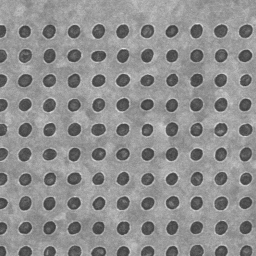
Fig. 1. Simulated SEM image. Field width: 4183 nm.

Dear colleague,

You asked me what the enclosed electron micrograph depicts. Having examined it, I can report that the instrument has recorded a regular array of holes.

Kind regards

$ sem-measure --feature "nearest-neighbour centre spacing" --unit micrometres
0.396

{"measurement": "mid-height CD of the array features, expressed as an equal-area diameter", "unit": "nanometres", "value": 220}